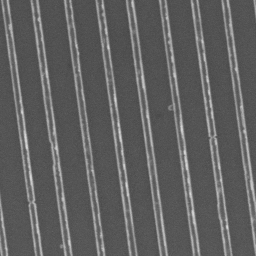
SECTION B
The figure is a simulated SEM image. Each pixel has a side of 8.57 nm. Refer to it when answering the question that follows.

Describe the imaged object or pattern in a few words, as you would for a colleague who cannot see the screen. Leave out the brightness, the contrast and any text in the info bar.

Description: parallel lines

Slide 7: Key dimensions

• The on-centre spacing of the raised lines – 31.2 px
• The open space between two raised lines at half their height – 210 nm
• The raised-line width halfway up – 57.4 nanometers